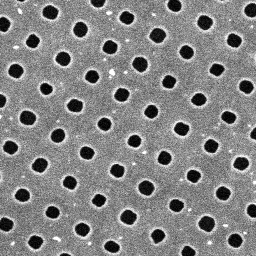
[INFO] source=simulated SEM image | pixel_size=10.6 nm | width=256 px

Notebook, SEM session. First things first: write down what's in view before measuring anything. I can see a regular array of holes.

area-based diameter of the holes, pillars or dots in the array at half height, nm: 150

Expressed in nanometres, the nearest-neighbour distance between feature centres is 360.